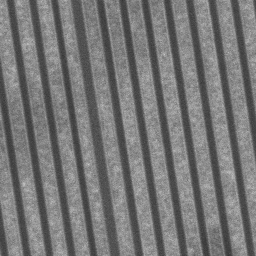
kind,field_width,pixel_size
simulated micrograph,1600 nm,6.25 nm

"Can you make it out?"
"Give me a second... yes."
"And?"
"parallel lines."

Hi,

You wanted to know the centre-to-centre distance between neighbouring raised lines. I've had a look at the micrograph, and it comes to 138 nm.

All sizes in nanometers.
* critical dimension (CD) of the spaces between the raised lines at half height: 44.8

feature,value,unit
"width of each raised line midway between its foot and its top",94.1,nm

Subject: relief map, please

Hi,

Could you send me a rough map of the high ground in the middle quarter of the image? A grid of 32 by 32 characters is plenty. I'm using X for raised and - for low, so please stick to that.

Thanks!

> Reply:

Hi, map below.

-XXX---XXX---XXX--XXXX--XXX--XXX
-XXX---XXXX--XXX--XXXX--XXXX-XXX
-XXX---XXXX--XXXX-XXXX--XXXX--XX
--XXX--XXXX--XXXX--XXX--XXXX--XX
--XXX---XXX--XXXX--XXX--XXXX--XX
--XXX---XXX--XXXX--XXXX-XXXX--XX
--XXX---XXX--XXXX--XXXX--XXX--XX
--XXX---XXX---XXX--XXXX--XXX--XX
--XXX---XXXX--XXX--XXXX--XXXX--X
X-XXX---XXXX--XXXX--XXX--XXXX--X
X--XXX--XXXX--XXXX--XXX--XXXX--X
X--XXX---XXX--XXXX--XXX--XXXX--X
X--XXX---XXX--XXXX--XXXX--XXX--X
X--XXX---XXX---XXX--XXXX--XXX--X
X--XXX---XXXX--XXX--XXXX--XXXX-X
X--XXX---XXXX--XXXX-XXXX--XXXX--
XX--XXX--XXXX--XXXX--XXX--XXXX--
XX--XXX---XXX--XXXX--XXX--XXXX--
XX--XXX---XXX--XXXX--XXXX-XXXX--
XX--XXX---XXX--XXXX--XXXX--XXX--
XX--XXX---XXX---XXX--XXXX--XXX--
XX--XXX---XXXX--XXX--XXXX--XXXX-
XXX-XXX---XXXX--XXXX--XXX--XXXX-
XXX--XXX--XXXX--XXXX--XXX--XXXX-
XXX--XXX---XXX--XXXX--XXX--XXXX-
XXX--XXX---XXX--XXXX--XXXX--XXX-
XXX--XXX---XXX---XXX--XXXX--XXX-
XXX--XXX---XXXX--XXX--XXXX--XXXX
XXX--XXX---XXXX--XXXX-XXXX--XXXX
XXXX--XXX--XXXX--XXXX--XXX--XXXX
XXXX--XXX---XXX--XXXX--XXX--XXXX
XXXX--XXX---XXX--XXXX--XXXX-XXXX